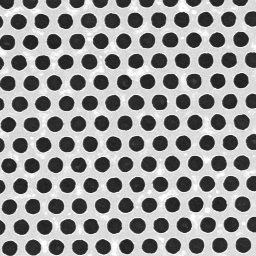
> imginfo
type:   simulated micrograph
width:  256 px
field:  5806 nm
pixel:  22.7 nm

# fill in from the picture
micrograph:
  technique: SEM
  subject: a regular array of holes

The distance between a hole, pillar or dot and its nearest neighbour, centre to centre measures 0.527 micrometres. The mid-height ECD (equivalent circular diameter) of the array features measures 0.356 micrometres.